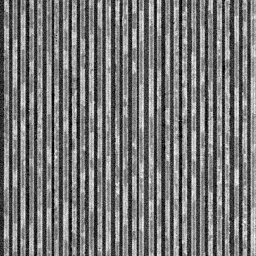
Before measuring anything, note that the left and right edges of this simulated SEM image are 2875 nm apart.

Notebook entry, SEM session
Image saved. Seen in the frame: parallel lines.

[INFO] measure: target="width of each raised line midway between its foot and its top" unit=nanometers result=40.7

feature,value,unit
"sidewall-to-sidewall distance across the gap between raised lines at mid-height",0.0505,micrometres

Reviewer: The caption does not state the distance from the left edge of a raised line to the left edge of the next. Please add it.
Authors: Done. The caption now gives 95.6 nm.